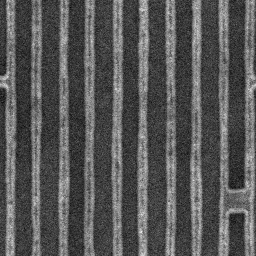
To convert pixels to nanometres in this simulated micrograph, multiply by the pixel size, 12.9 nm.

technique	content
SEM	parallel lines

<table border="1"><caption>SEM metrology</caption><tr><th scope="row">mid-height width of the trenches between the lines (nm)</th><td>263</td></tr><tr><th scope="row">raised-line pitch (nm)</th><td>342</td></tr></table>